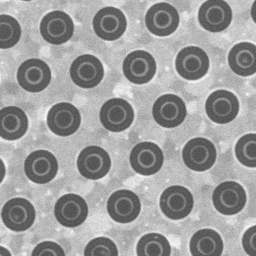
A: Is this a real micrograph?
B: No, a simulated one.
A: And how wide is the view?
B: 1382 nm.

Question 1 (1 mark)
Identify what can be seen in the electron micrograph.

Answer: an array of small figures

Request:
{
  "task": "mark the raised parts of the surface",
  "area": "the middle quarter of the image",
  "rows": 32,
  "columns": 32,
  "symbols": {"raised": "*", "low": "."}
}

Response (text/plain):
*...***...****...****..****...**
*...****..*****..****..*****...*
*...****..*****...**...*****....
**..***...******......*******...
**.......*******.....***********
***.....************************
********************************
*************************...****
************..*********......***
.*********......*******.......**
...******........*****...***...*
....*****...***...****..****...*
**..*****..****...****..****...*
**...****..****...****...***..**
**..*****...**....*****.......**
*...******.......*******.....***
....*******.....****************
..******************************
********************************
*******************...*********.
******...*********......******..
****......*******........****...
****.......*****...***...****...
***...***...****...****..****...
***..****...****...***...*****..
***..****...*****...**...*****..
***...***...*****.......********
****.......*******.....*********
*****.....**********************
********************************
***************************...**
*************....********......*